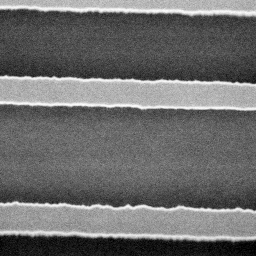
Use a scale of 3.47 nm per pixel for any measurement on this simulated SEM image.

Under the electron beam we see lines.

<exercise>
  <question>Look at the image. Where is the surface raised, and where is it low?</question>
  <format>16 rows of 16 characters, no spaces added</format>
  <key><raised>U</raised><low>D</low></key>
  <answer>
DDUUUUUUUUUUUUUU
DDDDDDDDDDDDDDDD
DDDDDDDDDDDDDDDD
DDDDDDDDDDDDDDDD
DDDDDDDDDDDDDDDD
UUUUUUUUUUUUUUUU
DUUUUUUUUUUUUUUU
DDDDDDDDDDDDDDDD
DDDDDDDDDDDDDDDD
DDDDDDDDDDDDDDDD
DDDDDDDDDDDDDDDD
DDDDDDDDDDDDDDDD
DDDDDDDDDDDDDDDD
UUUUUUUUUUUUUUUU
UUUUUUUUUUUUUUUU
DDDDDDDDDDDDDDDD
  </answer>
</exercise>